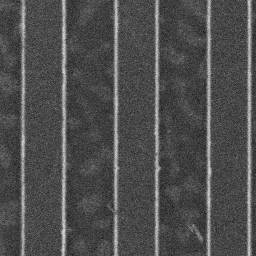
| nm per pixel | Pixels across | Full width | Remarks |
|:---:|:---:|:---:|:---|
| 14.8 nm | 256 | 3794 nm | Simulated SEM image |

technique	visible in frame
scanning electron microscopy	one or a few lines or trenches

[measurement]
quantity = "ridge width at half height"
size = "0.606 microns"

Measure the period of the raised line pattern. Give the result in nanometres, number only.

1380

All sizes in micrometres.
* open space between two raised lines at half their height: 0.771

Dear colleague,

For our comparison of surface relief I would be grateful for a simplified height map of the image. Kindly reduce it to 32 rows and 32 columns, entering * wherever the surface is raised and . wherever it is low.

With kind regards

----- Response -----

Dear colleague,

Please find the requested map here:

...*****.......*****......*****.
...*****.......*****......*****.
...*****.......*****......*****.
...*****.......*****......*****.
...*****.......*****......*****.
...*****.......*****......*****.
...*****.......*****......*****.
...*****.......*****......*****.
...*****.......*****......*****.
...*****.......*****......*****.
...*****.......*****......*****.
...*****.......*****......*****.
...*****.......*****......*****.
...*****.......*****......*****.
...*****.......*****......*****.
...*****.......*****......*****.
...*****.......*****......*****.
...*****.......*****......*****.
...*****.......*****......*****.
...*****.......*****......*****.
...*****.......*****......*****.
...*****.......*****......*****.
...*****.......*****......*****.
...*****.......*****......*****.
...*****.......*****......*****.
...*****.......****.......*****.
...*****......*****.......*****.
...*****.......****.......*****.
...*****.......****.......*****.
...*****.......****.......*****.
...*****.......****.......*****.
...*****.......****.......*****.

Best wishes